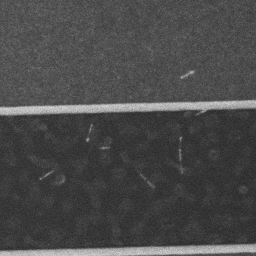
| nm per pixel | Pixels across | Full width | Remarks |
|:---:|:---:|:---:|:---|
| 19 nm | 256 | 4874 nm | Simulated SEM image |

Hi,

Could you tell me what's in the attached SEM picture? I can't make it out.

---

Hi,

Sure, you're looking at one or a few lines or trenches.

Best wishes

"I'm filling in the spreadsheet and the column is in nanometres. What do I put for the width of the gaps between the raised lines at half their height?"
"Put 2740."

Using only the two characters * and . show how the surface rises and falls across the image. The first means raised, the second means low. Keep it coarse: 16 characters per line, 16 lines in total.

****************
****************
****************
****************
****************
****************
****************
................
................
................
................
................
................
................
................
................